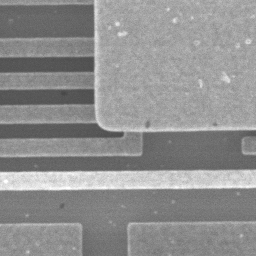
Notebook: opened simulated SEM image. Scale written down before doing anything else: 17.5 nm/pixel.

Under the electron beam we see wiring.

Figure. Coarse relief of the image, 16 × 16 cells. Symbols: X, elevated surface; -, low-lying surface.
------XXXXXXXXXX
------XXXXXXXXXX
------XXXXXXXXXX
------XXXXXXXXXX
------XXXXXXXXXX
------XXXXXXXXXX
------XXXXXXXXXX
------XXXXXXXXXX
----------------
----------------
----------------
----------------
----------------
----------------
----------------
----------------